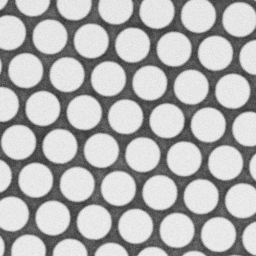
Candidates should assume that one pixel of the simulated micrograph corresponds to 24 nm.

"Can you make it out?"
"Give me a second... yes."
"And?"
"an array of small figures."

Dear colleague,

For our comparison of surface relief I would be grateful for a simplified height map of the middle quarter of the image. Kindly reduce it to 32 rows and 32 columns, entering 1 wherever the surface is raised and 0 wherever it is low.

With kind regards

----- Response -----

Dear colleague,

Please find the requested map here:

11110000111111000000000000010000
11111001111111100001111100000000
11111001111111100011111110000111
11111001111111100111111111001111
11111001111111100111111111001111
11110001111111100111111111001111
11100000111111000011111110001111
00000000011110000011111110001111
00011110000000000001111100000111
00111111000001111000000000000011
01111111100011111110000011110000
01111111100111111110001111111000
01111111100111111111001111111100
01111111100111111111001111111100
01111111100111111110011111111100
00111111000011111110001111111100
00000000000001111100001111111000
11000000110000000000000111110000
11100011111100000001000000000000
11100011111110000111111000000000
11100111111110001111111000011111
11100111111111001111111100111111
11100111111110011111111100111111
11000011111110011111111100111111
10000011111110001111111100111111
00000000111000001111111000111111
01111100000000000011110000011111
11111110000111110000000000001111
11111110001111111000001111000000
11111110001111111100011111100000
11111111011111111100111111110001
11111110011111111100111111110011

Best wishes